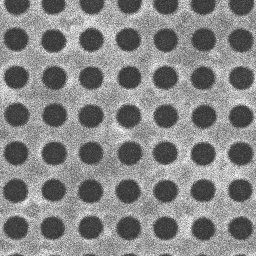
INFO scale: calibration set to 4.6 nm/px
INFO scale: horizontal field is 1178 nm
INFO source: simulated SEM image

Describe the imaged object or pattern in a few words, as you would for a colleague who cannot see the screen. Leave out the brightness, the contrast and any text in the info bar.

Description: a regular array of holes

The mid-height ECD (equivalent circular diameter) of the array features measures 24.4 pixels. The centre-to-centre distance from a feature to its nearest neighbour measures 36.8 px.